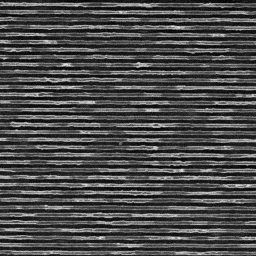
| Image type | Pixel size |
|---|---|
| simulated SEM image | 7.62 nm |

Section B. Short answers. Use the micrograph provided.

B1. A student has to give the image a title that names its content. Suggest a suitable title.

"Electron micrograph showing parallel lines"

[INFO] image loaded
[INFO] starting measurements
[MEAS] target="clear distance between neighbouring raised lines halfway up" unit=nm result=30.5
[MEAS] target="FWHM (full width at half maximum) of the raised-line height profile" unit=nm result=24.8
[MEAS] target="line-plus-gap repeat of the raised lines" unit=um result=0.0573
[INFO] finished